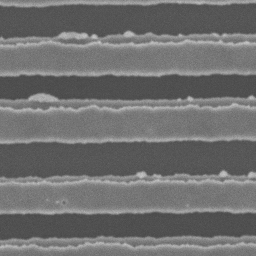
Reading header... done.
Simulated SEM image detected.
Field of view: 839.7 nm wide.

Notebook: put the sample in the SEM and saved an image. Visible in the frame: lines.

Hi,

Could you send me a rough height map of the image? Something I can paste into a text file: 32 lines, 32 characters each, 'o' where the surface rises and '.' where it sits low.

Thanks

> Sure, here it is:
oooooooooooooooooooo....ooooo...
................................
................................
................................
.......ooooo.ooooooooooooooooooo
oooooooooooooooooooooooooooooooo
oooooooooooooooooooooooooooooooo
oooooooooooooooooooooooooooooooo
oooooooooooooooooooooooooooooooo
...................o............
................................
................................
o.ooooooooooooo...o.oooooooooooo
oooooooooooooooooooooooooooooooo
oooooooooooooooooooooooooooooooo
oooooooooooooooooooooooooooooooo
oooooooooooooooooooooooooooooooo
ooooooooooooooooooooooo..oooo..o
................................
................................
................................
................................
oooooooooooooooooooooooooooooooo
oooooooooooooooooooooooooooooooo
oooooooooooooooooooooooooooooooo
oooooooooooooooooooooooooooooooo
ooooooooooooooooooo.oooo.....ooo
................................
................................
................................
oooooooooooooooooooooooooooooooo
oooooooooooooooooooooooooooooooo